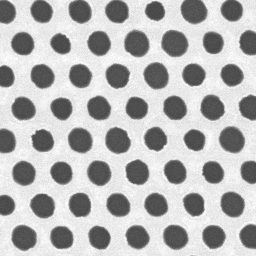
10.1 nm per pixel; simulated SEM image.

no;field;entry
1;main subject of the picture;a regular array of holes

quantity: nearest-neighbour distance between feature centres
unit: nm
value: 375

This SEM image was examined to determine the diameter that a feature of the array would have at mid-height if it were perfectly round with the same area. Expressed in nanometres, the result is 223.